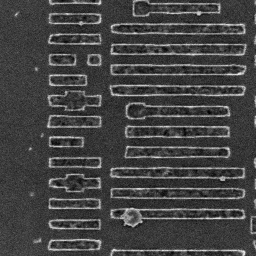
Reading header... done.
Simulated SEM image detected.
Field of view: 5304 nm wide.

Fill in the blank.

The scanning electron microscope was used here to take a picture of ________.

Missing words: wiring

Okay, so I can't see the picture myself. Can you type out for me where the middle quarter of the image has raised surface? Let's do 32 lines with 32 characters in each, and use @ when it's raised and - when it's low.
------------@@@@@@@@@@@@@@@@@@@@
------------@@@@@@@@@@@@@@@@@@@@
------------@@@@@@@@@@@@@@@@@@@@
@@@@@@--------------------------
@@@@@@--------------------------
-------------@@@@@@@@@----------
------------@@@@@@@@@@@@@@@@@@@@
@@@@@-------@@@@@@@@@@@@@@@@@@@@
@@@@@@@@@-----------------------
@@@@@@@@@-----------------------
@@@@@@----------@@@@@@----------
----------------@@@@@@@@@@@@@@@@
----------------@@@@@@@@@@@@@@@@
@@@@@@@@@-------@@@@------------
@@@@@@@@@-----------------------
@@@@@@@@@-----------------------
----------------@@@@@@@@@@@@@@@@
----------------@@@@@@@@@@@@@@@@
@@@@@---------------------------
@@@@@---------------------------
@@@@@---------------------------
----------------@@@@@@@@@@@@@@@@
---------------@@@@@@@@@@@@@@@@@
--------------------------------
@@@@@@@@@-----------------------
@@@@@@@@@-----------------------
------------@@@@@@@@@@@@@@@@@@@@
------------@@@@@@@@@@@@@@@@@@@@
@@@@@---------------------------
@@@@@@@@@-----------------------
@@@@@@@@@-----------------------
-@@@@-------@@@@@@@@@@@@@@@@@@@@